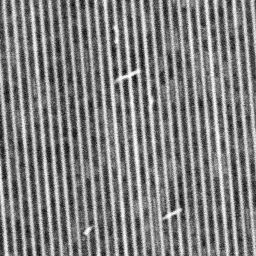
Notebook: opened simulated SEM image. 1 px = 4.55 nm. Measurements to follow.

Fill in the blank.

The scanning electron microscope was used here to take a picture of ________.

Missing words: parallel lines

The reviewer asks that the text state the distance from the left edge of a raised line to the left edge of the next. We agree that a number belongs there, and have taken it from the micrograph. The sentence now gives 0.0417 micrometres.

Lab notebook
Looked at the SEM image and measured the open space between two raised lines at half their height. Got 31.2 nm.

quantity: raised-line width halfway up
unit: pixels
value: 2